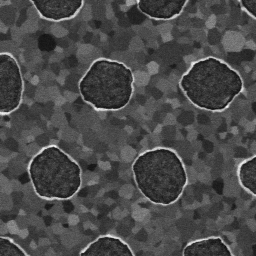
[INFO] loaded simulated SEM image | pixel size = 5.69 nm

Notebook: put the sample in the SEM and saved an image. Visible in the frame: holes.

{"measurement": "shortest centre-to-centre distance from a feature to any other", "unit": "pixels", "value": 104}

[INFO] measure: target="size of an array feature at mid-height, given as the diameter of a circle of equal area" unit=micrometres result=0.298